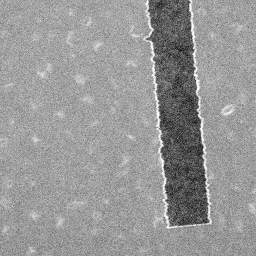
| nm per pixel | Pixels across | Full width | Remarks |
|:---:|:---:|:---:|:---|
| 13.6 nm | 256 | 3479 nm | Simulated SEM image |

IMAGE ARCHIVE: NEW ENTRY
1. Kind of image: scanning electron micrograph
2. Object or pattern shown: one or a few lines or trenches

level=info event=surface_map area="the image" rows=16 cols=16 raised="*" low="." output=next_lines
.........***....
.........***....
.........***....
..........**....
..........**....
..........**....
..........**....
..........***...
..........***...
..........***...
..........***...
..........***...
..........***...
..........***...
................
................